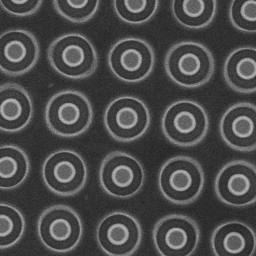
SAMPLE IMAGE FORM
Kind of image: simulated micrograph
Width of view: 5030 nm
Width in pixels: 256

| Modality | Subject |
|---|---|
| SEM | an array of small figures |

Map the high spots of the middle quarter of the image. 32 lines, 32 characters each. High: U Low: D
DDDDDDDDUUUUDDDUUUUDDDUUUUDDDUUU
DDDDDDDUUUUUDDDDDDDDDDUUUUDDDUUU
DDDDDDUUUUUUUDDDDDDDDUUUUUDDDDDD
UUUUUUUUUUUUUUDDDDDUUUUUUUUDDDDD
UUUUUUUUUUUUUUUUUUUUUUUUUUUUDDDD
UUUUUUUUUUUUUUUUUUUUUUUUUUUUUUUD
UUUUUUUUUUUUUUUUUUUUUUUUUUUUUUUU
DDDDUUUUUUUUUUUUUUUUUUUUUUUUUUUU
DDDDDUUUUUUUUUUDDUUUUUUUUUUUUUUU
DDDDDDUUUUUUUDDDDDDUUUUUUUUUUUDU
UUDDDDUUUUUUDDDDDDDDUUUUUUUDDDDD
UUUDDDDUUUUDDDDUUDDDDUUUUUDDDDDD
UUUDDDDUUUUDDDUUUUDDDUUUUDDDDUUD
UUUDDDDUUUDDDUUUUUDDDUUUUDDDUUUU
UUDDDDUUUUDDDDUUUUDDDUUUUDDDUUUU
DDDDDDUUUUUDDDUUUDDDDUUUUDDDUUUU
DDDDDUUUUUUDDDDDDDDDUUUUUDDDDUUD
DDDUUUUUUUUUDDDDDDDUUUUUUUDDDDDD
UUUUUUUUUUUUUDDDDDUUUUUUUUDDDDDD
UUUUUUUUUUUUUUUUUUUUUUUUUUUUDDDD
UUUUUUUUUUUUUUUUUUUUUUUUUUUUUUUU
UUUUUUUUUUUUUUUUUUUUUUUUUUUUUUUU
DDDUUUUUUUUUUDDUUUUUUUUUUUUUUUUU
DDDDUUUUUUUDDDDDDUUUUUUUUUUUUDUU
DDDDDUUUUUDDDDDDDDUUUUUUUUDDDDDD
UUDDDUUUUUDDDDDDDDDUUUUUUDDDDDDD
UUDDDUUUUDDDDUUUDDDUUUUUUDDDDDDD
UUDDDUUUUDDDUUUUUDDDUUUUDDDDUUUD
UUDDDUUUUDDDUUUUUDDDUUUUDDDUUUUD
DDDDDUUUUUDDDUUUDDDUUUUUDDDUUUUD
DDDDUUUUUUDDDDDDDDDUUUUUDDDUUUUD
DDDUUUUUUUUDDDDDDDUUUUUUUDDDDDDD